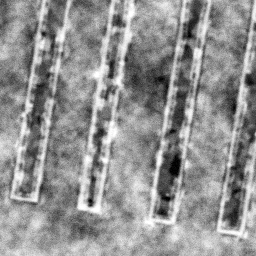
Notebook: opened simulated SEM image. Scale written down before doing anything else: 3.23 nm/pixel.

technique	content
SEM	one or a few lines or trenches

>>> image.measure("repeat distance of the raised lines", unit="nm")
225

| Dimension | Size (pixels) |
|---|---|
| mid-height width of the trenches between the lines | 45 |